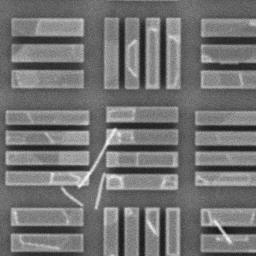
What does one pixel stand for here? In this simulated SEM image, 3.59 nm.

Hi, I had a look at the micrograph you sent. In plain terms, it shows groups of lines, slits or small figures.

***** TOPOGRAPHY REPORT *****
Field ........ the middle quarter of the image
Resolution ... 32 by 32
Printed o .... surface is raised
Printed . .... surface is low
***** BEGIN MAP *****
..........oooo..ooo.oooo..ooo...
..........oooo..ooo.oooo..ooo...
ooooo.....oooo..ooo.oooo..ooo...
ooooo.....oooo..ooo.oooo..ooo...
ooooo.....oooo..ooo.oooo..ooo...
ooooo.....oooo..ooo.oooo..ooo...
................................
................................
................................
................................
................................
...........ooooooooooooooooo....
oooooo.....ooooooooooooooooo....
oooooo.....ooooooooooooooooo....
oooooo..........................
................................
............o...................
oooooo.....ooooooooooooooooo....
oooooo.....ooooooooooooooooo....
oooooo.....ooooooooooooooooo....
................................
................................
oooooo.....ooooooooooooooooo....
oooooo.....ooooooooooooooooo....
oooooo.....ooooooooooooooooo....
...........ooooooooooooooooo....
................................
ooooooo.........................
oooooo.....ooooooooooooooooo....
oooooo.....ooooooooooooooooo....
...o.......ooooooooooooooooo....
................................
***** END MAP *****